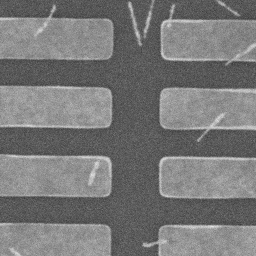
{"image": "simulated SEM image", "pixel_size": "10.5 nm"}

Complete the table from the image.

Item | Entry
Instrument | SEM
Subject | groups of lines, slits or small figures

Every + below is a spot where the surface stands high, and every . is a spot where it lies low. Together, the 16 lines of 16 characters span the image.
................
+++++++...++++++
+++++++...++++++
+++++++...++++++
................
++++............
+++++++...++++++
+++++++...++++++
................
................
+++++++...++++++
+++++++...++++++
................
................
+++++++...++++++
+++++++...++++++